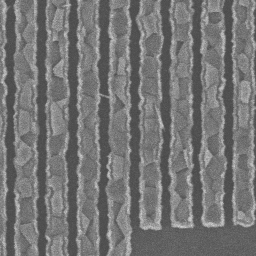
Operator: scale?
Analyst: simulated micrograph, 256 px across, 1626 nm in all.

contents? parallel lines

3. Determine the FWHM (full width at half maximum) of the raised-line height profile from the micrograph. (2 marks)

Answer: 141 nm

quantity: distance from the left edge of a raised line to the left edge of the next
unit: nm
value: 197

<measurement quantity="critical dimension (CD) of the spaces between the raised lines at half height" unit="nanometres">59.5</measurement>